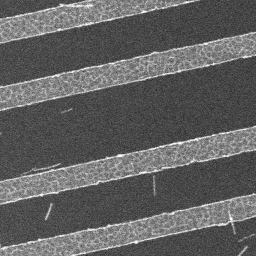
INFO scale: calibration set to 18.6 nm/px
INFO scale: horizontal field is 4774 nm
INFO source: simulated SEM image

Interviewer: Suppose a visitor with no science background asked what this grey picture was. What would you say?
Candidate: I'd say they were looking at one or a few lines or trenches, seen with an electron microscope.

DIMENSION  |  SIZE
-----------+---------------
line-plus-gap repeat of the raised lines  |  1470 nanometers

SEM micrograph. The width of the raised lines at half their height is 417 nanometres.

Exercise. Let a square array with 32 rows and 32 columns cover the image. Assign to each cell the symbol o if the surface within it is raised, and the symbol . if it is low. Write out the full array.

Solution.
.........oooooooooooooo.........
.....ooooooooooooo..............
ooooooooooooo...................
ooooooooo.......................
oooo..........................oo
.........................ooooooo
....................oooooooooooo
................ooooooooooooo...
...........ooooooooooooo........
.......ooooooooooooo............
..ooooooooooooo.................
ooooooooooo.....................
oooooo..........................
o...............................
................................
................................
.............................ooo
........................oooooooo
...................ooooooooooooo
..............oooooooooooooo....
..........ooooooooooooo.........
......ooooooooooooo.............
.ooooooooooooo..................
ooooooooo.......................
oooo...........................o
..........................oooooo
......................oooooooooo
.................ooooooooooooo..
.............oooooooooooo.......
.......ooooooooooooo............
...ooooooooooooo................
ooooooooooo.....................